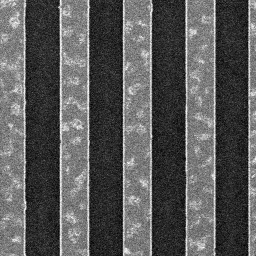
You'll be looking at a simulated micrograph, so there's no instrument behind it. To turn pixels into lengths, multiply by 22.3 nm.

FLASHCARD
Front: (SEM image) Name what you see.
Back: one or a few lines or trenches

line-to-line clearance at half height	0.79	um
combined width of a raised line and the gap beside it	1400	nanometres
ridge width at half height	615	nm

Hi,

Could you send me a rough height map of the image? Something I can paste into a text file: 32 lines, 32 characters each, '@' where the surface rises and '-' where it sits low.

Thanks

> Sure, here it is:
@@@-----@@@-----@@@----@@@@----@
@@@-----@@@-----@@@----@@@@----@
@@@-----@@@-----@@@----@@@@----@
@@@-----@@@-----@@@----@@@@----@
@@@-----@@@----@@@@----@@@@----@
@@@-----@@@-----@@@----@@@@----@
@@@-----@@@-----@@@----@@@@----@
@@@-----@@@-----@@@----@@@@----@
@@@-----@@@-----@@@----@@@@----@
@@@-----@@@-----@@@----@@@@----@
@@@-----@@@-----@@@----@@@@----@
@@@-----@@@-----@@@----@@@@----@
@@@-----@@@-----@@@----@@@@----@
@@@-----@@@-----@@@----@@@@----@
@@@-----@@@-----@@@----@@@@----@
@@@-----@@@-----@@@----@@@@----@
@@@-----@@@-----@@@----@@@@----@
@@@-----@@@-----@@@----@@@@----@
@@@-----@@@-----@@@----@@@@----@
@@@-----@@@-----@@@----@@@@----@
@@@-----@@@-----@@@----@@@@----@
@@@-----@@@-----@@@----@@@@----@
@@@-----@@@-----@@@----@@@@----@
@@@-----@@@-----@@@----@@@@----@
@@@-----@@@-----@@@----@@@@----@
@@@-----@@@-----@@@----@@@@----@
@@@-----@@@-----@@@----@@@@----@
@@@-----@@@-----@@@----@@@@----@
@@@-----@@@-----@@@----@@@@----@
@@@-----@@@-----@@@----@@@@----@
@@@-----@@@-----@@@----@@@@----@
@@@-----@@@-----@@@----@@@@----@